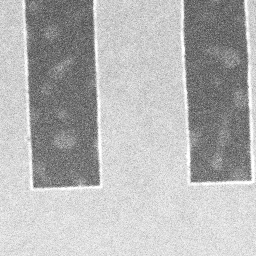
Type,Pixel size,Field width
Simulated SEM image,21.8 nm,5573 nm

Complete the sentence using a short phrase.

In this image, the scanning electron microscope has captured one or a few lines or trenches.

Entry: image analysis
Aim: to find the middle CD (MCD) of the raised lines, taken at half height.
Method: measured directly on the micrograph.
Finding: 1.43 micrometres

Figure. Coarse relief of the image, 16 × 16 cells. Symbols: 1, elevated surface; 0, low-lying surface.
0111110000011110
0011110000011110
0011110000011111
0011110000011111
0011110000001111
0011110000001111
0011110000001111
0011110000001111
0011110000001111
0011110000001111
0011110000001111
0011110000000000
0000000000000000
0000000000000000
0000000000000000
0000000000000000